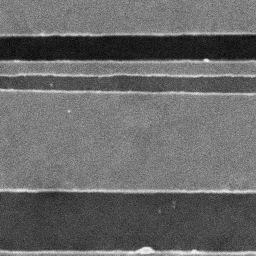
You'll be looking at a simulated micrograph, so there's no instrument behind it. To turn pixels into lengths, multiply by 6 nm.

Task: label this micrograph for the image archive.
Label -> lines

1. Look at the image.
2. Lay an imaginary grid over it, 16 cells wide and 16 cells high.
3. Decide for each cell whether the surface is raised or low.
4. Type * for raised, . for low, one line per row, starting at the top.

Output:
****************
****************
................
................
****************
****************
****************
****************
****************
****************
****************
****************
................
................
................
................